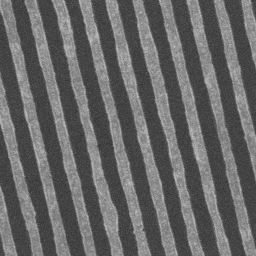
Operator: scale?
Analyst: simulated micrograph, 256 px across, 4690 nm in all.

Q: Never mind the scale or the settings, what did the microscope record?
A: parallel lines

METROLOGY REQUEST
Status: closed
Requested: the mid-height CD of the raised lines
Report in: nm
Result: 178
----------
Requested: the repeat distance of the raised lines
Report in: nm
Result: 476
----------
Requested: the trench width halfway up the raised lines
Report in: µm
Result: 0.292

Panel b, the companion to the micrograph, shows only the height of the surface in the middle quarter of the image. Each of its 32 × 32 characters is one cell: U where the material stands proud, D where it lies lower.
DUUDDDDDUUDDDDUUUDDDDUUUDDDDUUDD
DUUUDDDDUUDDDDUUUDDDDUUUDDDDUUDD
DDUUDDDDUUUDDDDUUDDDDUUUDDDDUUUD
DDUUDDDDDUUDDDDUUUDDDDUUUDDDDUUD
DDUUUDDDDUUDDDDUUUDDDDUUUDDDDUUD
DDUUUDDDDUUDDDDUUUDDDDUUUDDDDUUD
DDDUUDDDDUUDDDDDUUDDDDDUUDDDDUUU
DDDUUDDDDUUUDDDDUUDDDDDUUUDDDUUU
DDDUUUDDDDUUDDDDUUUDDDDUUUDDDDUU
DDDUUUDDDDUUDDDDDUUDDDDUUUDDDDUU
DDDDUUDDDDUUUDDDDUUDDDDUUUDDDDUU
DDDDUUDDDDDUUDDDDUUDDDDDUUDDDDUU
DDDDUUDDDDDUUDDDDUUUDDDDUUDDDDDU
DDDDUUDDDDDUUDDDDDUUDDDDUUUDDDDU
DDDDDUDDDDDDUUDDDDUUDDDDUUUDDDDU
DDDDDUUDDDDDUUDDDDUUDDDDDUUDDDDU
UDDDDUUDDDDDUUDDDDUUUDDDDUUUDDDU
UDDDDUUUDDDDUUDDDDDUUDDDDUUUDDDD
UDDDDDUUDDDDUUDDDDDUUDDDDDUUDDDD
UDDDDDUUDDDDUUUDDDDUUDDDDDUUDDDD
UDDDDDUUDDDDDUUDDDDUUUDDDDUUDDDD
UUDDDDUUDDDDDUUDDDDUUUDDDDUUUDDD
UUDDDDDUUDDDDUUDDDDDUUDDDDDUUDDD
UUDDDDDUUDDDDUUUDDDDUUDDDDDUUDDD
UUUDDDDUUDDDDUUUDDDDUUDDDDDUUUDD
UUUDDDDUUDDDDUUUDDDDDUUDDDDUUUDD
DUUDDDDUUUDDDDUUDDDDDUUDDDDDUUDD
DUUDDDDUUUDDDDUUUDDDDUUDDDDDUUDD
DUUUDDDDUUDDDDUUUDDDDUUUDDDDUUDD
DUUUDDDDUUDDDDUUUDDDDUUUDDDDUUDD
DDUUDDDDUUUDDDDUUDDDDUUUDDDDUUDD
DDUUDDDDUUUDDDDUUUDDDDUUUDDDDUUD